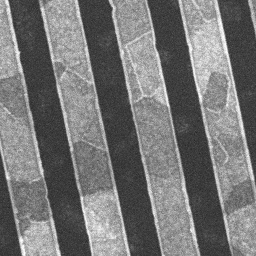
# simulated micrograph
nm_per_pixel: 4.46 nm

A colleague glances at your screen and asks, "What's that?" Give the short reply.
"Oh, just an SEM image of one or a few lines or trenches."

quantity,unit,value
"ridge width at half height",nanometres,160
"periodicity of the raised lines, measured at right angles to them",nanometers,305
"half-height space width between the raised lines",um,0.143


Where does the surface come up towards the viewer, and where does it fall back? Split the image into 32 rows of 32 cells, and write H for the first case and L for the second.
HLLLLHHHHHLLLLHHHHLLLLLHHHHLLLLH
HLLLLHHHHHLLLLHHHHHLLLLHHHHLLLLH
HLLLLLHHHHLLLLHHHHHLLLLHHHHLLLLL
HHLLLLHHHHLLLLHHHHHLLLLHHHHHLLLL
HHLLLLHHHHHLLLLHHHHLLLLHHHHHLLLL
HHLLLLHHHHHLLLLHHHHLLLLLHHHHLLLL
HHLLLLHHHHHLLLLHHHHHLLLLHHHHLLLL
HHLLLLLHHHHLLLLHHHHHLLLLHHHHHLLL
HHHLLLLHHHHLLLLLHHHHLLLLHHHHHLLL
HHHLLLLHHHHHLLLLHHHHLLLLHHHHHLLL
HHHLLLLHHHHHLLLLHHHHHLLLLHHHHLLL
HHHLLLLHHHHHLLLLHHHHHLLLLHHHHLLL
HHHLLLLLHHHHLLLLHHHHHLLLLHHHHHLL
HHHHLLLLHHHHLLLLLHHHHLLLLHHHHHLL
HHHHLLLLHHHHHLLLLHHHHLLLLHHHHHLL
HHHHLLLLHHHHHLLLLHHHHHLLLLHHHHLL
HHHHLLLLHHHHHLLLLHHHHHLLLLHHHHLL
HHHHLLLLLHHHHLLLLHHHHHLLLLHHHHHL
HHHHHLLLLHHHHLLLLLHHHHLLLLHHHHHL
HHHHHLLLLHHHHHLLLLHHHHLLLLHHHHHL
LHHHHLLLLHHHHHLLLLHHHHHLLLLHHHHL
LHHHHLLLLHHHHHLLLLHHHHHLLLLHHHHL
LHHHHLLLLLHHHHLLLLHHHHHLLLLHHHHH
LHHHHHLLLLHHHHLLLLLHHHHLLLLHHHHH
LHHHHHLLLLHHHHHLLLLHHHHLLLLHHHHH
LLHHHHLLLLHHHHHLLLLHHHHHLLLLHHHH
LLHHHHLLLLHHHHHLLLLHHHHHLLLLHHHH
LLHHHHHLLLLHHHHLLLLHHHHHLLLLHHHH
LLHHHHHLLLLHHHHLLLLLHHHHLLLLHHHH
LLHHHHHLLLLHHHHHLLLLHHHHLLLLLHHH
LLLHHHHLLLLHHHHHLLLLHHHHHLLLLHHH
LLLHHHHLLLLLHHHHLLLLHHHHHLLLLHHH